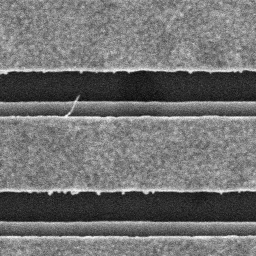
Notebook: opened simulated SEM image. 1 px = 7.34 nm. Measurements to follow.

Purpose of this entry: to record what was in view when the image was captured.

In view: lines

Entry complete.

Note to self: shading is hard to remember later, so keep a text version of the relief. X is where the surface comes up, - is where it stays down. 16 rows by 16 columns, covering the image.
XXXXXXXXXXXXXXXX
XXXXXXXXXXXXXXXX
XXXXXXXXXXXXXXXX
XXXXXXXXXXXXXXXX
X---------------
----------------
XXXXXXXXXXXXXXXX
XXXXXXXXXXXXXXXX
XXXXXXXXXXXXXXXX
XXXXXXXXXXXXXXXX
XXXXXXXXXXXXXXXX
XXXXXXXXXXXXXXXX
----------------
----------------
XXXXXXXXXXXXXXXX
XXXXXXXXXXXXXXXX